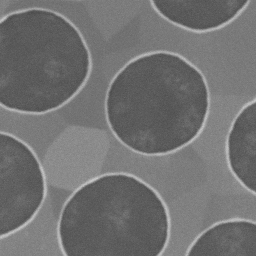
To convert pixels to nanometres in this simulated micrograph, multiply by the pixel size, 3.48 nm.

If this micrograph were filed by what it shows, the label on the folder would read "holes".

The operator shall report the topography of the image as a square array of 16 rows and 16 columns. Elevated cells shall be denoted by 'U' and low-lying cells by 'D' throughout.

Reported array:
UUUUUUUUUUDDDDDU
DDDDUUUUUUUDDDUU
DDDDDUUUUUUUUUUU
DDDDDDUUUDDUUUUU
DDDDDDUUDDDDUUUU
DDDDDUUDDDDDDUUU
DDDDUUUDDDDDDUUU
UUUUUUUDDDDDDUUD
DUUUUUUDDDDDUUDD
DDUUUUUUUDDUUUDD
DDDUUUUUUUUUUUDD
DDDUUDDDDUUUUUUD
DDDUDDDDDDUUUUUU
DDUUDDDDDDUUUUUU
DUUUDDDDDDDUUDDD
UUUUDDDDDDUUDDDD